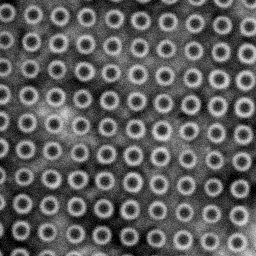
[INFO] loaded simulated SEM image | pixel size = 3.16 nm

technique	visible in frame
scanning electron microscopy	an array of small figures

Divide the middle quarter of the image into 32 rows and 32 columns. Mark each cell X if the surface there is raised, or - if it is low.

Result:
---XXXX----XX-----X-------------
---XXXX---XXXX---XXX----XXX-----
---XXXX---XXXX--XXXXX--XXXX---XX
----XXX---XXX---XXXXX--XXXX---XX
-----------------XXX----XXX---XX
-------------------------------X
--------------------------------
---XXX----XXX----XX-------------
---XXXX--XXXXX--XXXX---XXXX---XX
---XXXX--XXXXX--XXXX---XXXX---XX
---XXX----XXX---XXXX---XXXX---XX
------------------X-----XX----XX
--------------------------------
---XX---------------------------
--XXXX---XXXX----XX-------------
--XXXX---XXXX---XXXX---XXX----XX
--XXXX---XXXX---XXXX--XXXXX--XXX
---XX-----XX----XXXX--XXXX---XXX
-----------------------XXX----XX
--------------------------------
---XX---------------------------
--XXXX---XXXX---XXX----XX-------
--XXXX--XXXXX--XXXX---XXXX---XXX
--XXXX---XXXX--XXXX---XXXX---XXX
---------XXX----XXX---XXXX---XXX
------------------------------XX
--------------------------------
--XXX----XXX----XX--------------
-XXXXX--XXXX---XXXX---XXX-----XX
-XXXXX--XXXX---XXXX---XXXX---XXX
--XXX----XXX---XXXX---XXXX---XXX
----------------XXX---XXX----XXX